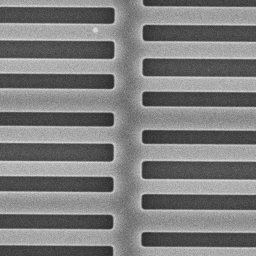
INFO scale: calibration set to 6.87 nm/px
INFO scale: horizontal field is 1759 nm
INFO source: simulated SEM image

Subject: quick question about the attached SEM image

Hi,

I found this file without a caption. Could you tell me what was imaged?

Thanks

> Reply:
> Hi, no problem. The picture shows groups of lines, slits or small figures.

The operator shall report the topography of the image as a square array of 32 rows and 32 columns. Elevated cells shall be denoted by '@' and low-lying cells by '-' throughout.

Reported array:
@@@@@@@@@@@@@@@@@@--------------
--------------@@@@@@@@@@@@@@@@@@
--------------@@@@@@@@@@@@@@@@@@
@@@@@@@@@@@@@@@@@@--------------
@@@@@@@@@@@@@@@@@@--------------
--------------@@@@@@@@@@@@@@@@@@
--------------@@@@@@@@@@@@@@@@@@
@@@@@@@@@@@@@@@@@@--------------
@@@@@@@@@@@@@@@@@@--------------
--------------@@@@--------------
--------------@@@@@@@@@@@@@@@@@@
@@@@@@@@@@@@@@@@@@--------------
@@@@@@@@@@@@@@@@@@--------------
@@@@@@@@@@@@@@@@@@@@@@@@@@@@@@@@
--------------@@@@@@@@@@@@@@@@@@
--------------@@@@@@@@@@@@@@@@@@
@@@@@@@@@@@@@@@@@@--------------
@@@@@@@@@@@@@@@@@@--------------
--------------@@@@@@@@@@@@@@@@@@
--------------@@@@@@@@@@@@@@@@@@
@@@@@@@@@@@@@@@@@@--------------
@@@@@@@@@@@@@@@@@@--------------
--------------@@@@@@@@@@@@@@@---
--------------@@@@@@@@@@@@@@@@@@
@@@@@@@@@@@@@@@@@@--------------
@@@@@@@@@@@@@@@@@@--------------
@@@@@@@@@@@@@@@@@@@@@@@@@@@@@@@@
--------------@@@@@@@@@@@@@@@@@@
--------------@@@@@@@@@@@@@@@@@@
@@@@@@@@@@@@@@@@@@--------------
@@@@@@@@@@@@@@@@@@--------------
--------------@@@@@@@@@@@@@@@@@@